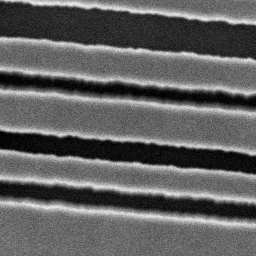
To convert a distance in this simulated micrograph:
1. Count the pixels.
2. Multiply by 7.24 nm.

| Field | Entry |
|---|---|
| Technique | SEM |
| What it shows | lines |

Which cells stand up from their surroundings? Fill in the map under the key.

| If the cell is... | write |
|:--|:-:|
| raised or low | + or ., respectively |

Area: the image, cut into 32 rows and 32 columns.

.....+++++++++++++++++++++++++++
.................+++++++++++++++
............................++++
................................
................................
++++++++++......................
++++++++++++++++++++............
++++++++++++++++++++++++++++++++
++++++++++++++++++++++++++++++++
.......+++++++++++++++++++++++++
..................++++++++++++++
++++.........................+++
+++++++++++++++++...............
++++++++++++++++++++++++++......
++++++++++++++++++++++++++++++++
++++++++++++++++++++++++++++++++
..+.++++++++++++++++++++++++++++
..............++++++++++++++++++
..........................++++++
+++++++.........................
++++++++++++++++++..............
+++++++++++++++++++++++++++++...
.+++++++++++++++++++++++++++++++
..............++++++++++++++++++
........................++++++++
+++++...........................
+++++++++++++++.................
+++++++++++++++++++++++++++.....
++++++++++++++++++++++++++++++++
++++++++++++++++++++++++++++++++
++++++++++++++++++++++++++++++++
++++++++++++++++++++++++++++++++